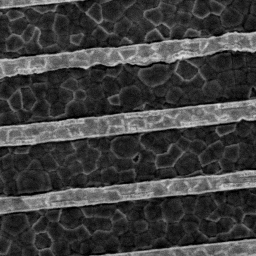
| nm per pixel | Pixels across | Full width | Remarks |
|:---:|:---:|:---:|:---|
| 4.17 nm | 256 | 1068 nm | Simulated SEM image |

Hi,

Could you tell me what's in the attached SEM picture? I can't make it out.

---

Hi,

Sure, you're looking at one or a few lines or trenches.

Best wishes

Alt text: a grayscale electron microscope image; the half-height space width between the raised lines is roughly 216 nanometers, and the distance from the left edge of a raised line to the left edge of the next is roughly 0.286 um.